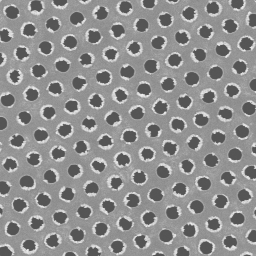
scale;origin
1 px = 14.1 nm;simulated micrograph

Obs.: a regular array of holes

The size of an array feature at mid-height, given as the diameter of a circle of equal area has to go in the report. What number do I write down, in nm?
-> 174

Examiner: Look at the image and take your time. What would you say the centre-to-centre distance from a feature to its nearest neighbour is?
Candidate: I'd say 335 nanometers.